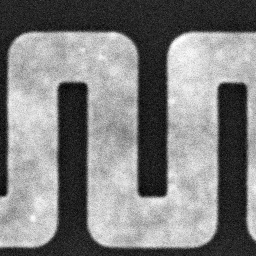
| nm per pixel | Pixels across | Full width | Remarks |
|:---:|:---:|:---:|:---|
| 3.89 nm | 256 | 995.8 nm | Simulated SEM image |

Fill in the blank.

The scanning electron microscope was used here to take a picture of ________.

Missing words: groups of lines, slits or small figures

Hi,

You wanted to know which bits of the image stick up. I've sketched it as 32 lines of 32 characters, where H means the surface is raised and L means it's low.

LLLLLLLLLLLLLLLLLLLLLLLLLLLLLLLL
LLLLLLLLLLLLLLLLLLLLLLLLLLLLLLLL
LLLLLLLLLLLLLLLLLLLLLLLLLLLLLLLL
LLLLLLLLLLLLLLLLLLLLLLLLLLLLLLLL
LLLHHHHHHHHHHHHLLLLLLLLHHHHHHHHH
LLHHHHHHHHHHHHHHHLLLLLHHHHHHHHHH
LHHHHHHHHHHHHHHHHLLLLHHHHHHHHHHH
LHHHHHHHHHHHHHHHHLLLLHHHHHHHHHHH
LHHHHHHHHHHHHHHHHLLLLHHHHHHHHHHH
LHHHHHHHHHHHHHHHHLLLLHHHHHHHHHHH
LHHHHHHLLLLHHHHHHLLLLHHHHHHLLLLH
LHHHHHHLLLLHHHHHHLLLLHHHHHHLLLLH
LHHHHHHLLLLHHHHHHLLLLHHHHHHLLLLH
LHHHHHHLLLLHHHHHHLLLLHHHHHHLLLLH
LHHHHHHLLLLHHHHHHLLLLHHHHHHLLLLH
LHHHHHHLLLLHHHHHHLLLLHHHHHHLLLLH
LHHHHHHLLLLHHHHHHLLLLHHHHHHLLLLH
LHHHHHHLLLLHHHHHHLLLLHHHHHHLLLLH
LHHHHHHLLLLHHHHHHLLLLHHHHHHLLLLH
LHHHHHHLLLLHHHHHHLLLLHHHHHHLLLLH
LHHHHHHLLLLHHHHHHLLLLHHHHHHLLLLH
LHHHHHHLLLLHHHHHHLLLLHHHHHHLLLLH
LHHHHHHLLLLHHHHHHLLLLHHHHHHLLLLH
LHHHHHHLLLLHHHHHHLLLLHHHHHHLLLLH
LHHHHHHLLLLHHHHHHLLLLHHHHHHLLLLH
HHHHHHHLLLLHHHHHHHHHHHHHHHHLLLLH
HHHHHHHLLLLHHHHHHHHHHHHHHHHLLLLH
HHHHHHHLLLLHHHHHHHHHHHHHHHHLLLLH
HHHHHHHLLLLHHHHHHHHHHHHHHHHLLLLH
HHHHHHLLLLLLHHHHHHHHHHHHHHHLLLLL
HHHHHLLLLLLLLHHHHHHHHHHHHLLLLLLL
LLLLLLLLLLLLLLLLLLLLLLLLLLLLLLLL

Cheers